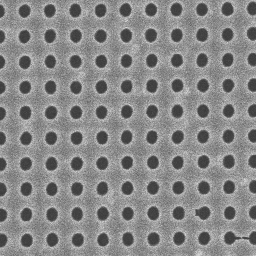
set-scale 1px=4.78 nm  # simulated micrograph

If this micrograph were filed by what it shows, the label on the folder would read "a regular array of holes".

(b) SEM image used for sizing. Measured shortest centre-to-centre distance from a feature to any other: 120 nm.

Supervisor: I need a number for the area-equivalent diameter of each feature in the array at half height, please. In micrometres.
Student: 0.0565